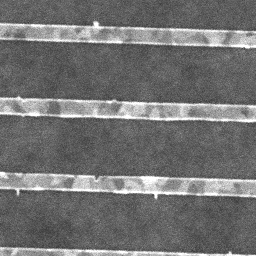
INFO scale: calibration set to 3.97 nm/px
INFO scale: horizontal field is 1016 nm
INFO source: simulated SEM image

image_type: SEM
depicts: one or a few lines or trenches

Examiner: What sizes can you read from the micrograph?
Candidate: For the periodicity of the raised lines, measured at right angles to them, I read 296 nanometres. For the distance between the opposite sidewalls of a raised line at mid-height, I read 15.9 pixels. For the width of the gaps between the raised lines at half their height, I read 234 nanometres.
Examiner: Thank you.